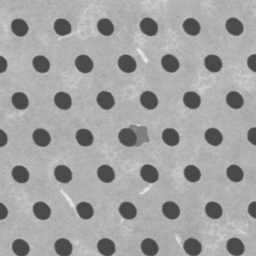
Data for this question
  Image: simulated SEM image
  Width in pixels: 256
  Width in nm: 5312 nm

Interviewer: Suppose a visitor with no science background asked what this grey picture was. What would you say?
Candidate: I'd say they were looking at a regular array of holes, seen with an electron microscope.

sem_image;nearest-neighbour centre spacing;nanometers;878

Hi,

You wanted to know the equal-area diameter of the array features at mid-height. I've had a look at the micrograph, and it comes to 377 nanometers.